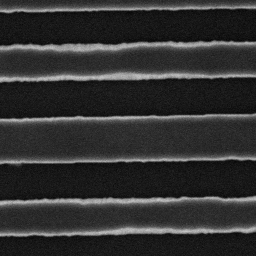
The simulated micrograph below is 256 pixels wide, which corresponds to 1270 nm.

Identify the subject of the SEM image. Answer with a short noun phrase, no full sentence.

lines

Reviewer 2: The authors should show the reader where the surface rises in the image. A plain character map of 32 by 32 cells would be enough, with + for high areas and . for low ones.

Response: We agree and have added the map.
++++++++++++++++++++++++++++++++
................................
................................
................................
................................
.................+++++++++++++++
++++++++++++++++++++++++++++++++
++++++++++++++++++++++++++++++++
++++++++++++++++++++++++++++++++
++++++++++++++++++++++++++++++++
................................
................................
................................
................................
......................++++++++++
++++++++++++++++++++++++++++++++
++++++++++++++++++++++++++++++++
++++++++++++++++++++++++++++++++
++++++++++++++++++++++++++++++++
++++++++++++++++++++++++++++++++
................................
................................
................................
................................
................................
++++++++++++++++++++++++++++++++
++++++++++++++++++++++++++++++++
++++++++++++++++++++++++++++++++
++++++++++++++++++++++++++++++++
................................
................................
................................